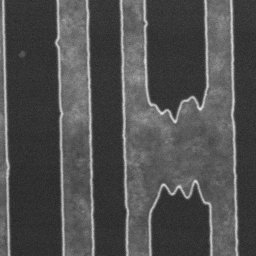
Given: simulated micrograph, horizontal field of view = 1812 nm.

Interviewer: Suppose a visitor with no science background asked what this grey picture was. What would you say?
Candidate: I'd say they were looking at one or a few lines or trenches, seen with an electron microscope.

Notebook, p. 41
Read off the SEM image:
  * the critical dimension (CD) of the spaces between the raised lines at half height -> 200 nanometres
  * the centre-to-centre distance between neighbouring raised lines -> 515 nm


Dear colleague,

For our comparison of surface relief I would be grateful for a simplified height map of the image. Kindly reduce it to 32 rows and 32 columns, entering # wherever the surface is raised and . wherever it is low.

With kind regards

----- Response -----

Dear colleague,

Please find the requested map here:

#######....####...########...###
#######....####...########...###
#######....####...########...###
#######....####...########...###
.######....####...########...###
.######....####...########...###
.######....####...########...###
.######....####...########...###
.######....####...########...###
.######....####...########...###
.#######...####...########...###
.#######...####...########...###
.#######...####....#######...###
.#######...#####....###......###
.#######...#####.....#.......###
.#######...#####.............###
.#######...#####.............###
.#######...#####.............###
.#######...#####.............###
.#######...#####.............###
.#######...#####.............###
.#######...#####.............###
.#######...#####.............###
.#######...#####....#...#....###
.#######...#####....#####....###
.#######...#####...#######...###
.#######...#####...#######...###
.#######....####...#######...###
.#######....####...#######...###
.#######....####...#######....##
.#######....####...#######....##
.#######....####...#######....##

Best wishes